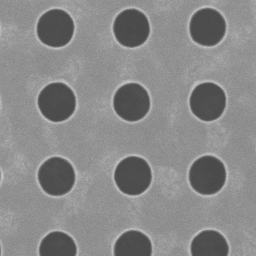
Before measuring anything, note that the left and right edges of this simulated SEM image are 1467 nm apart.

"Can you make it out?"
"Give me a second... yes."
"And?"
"a regular array of holes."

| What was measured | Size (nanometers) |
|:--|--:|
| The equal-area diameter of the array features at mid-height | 215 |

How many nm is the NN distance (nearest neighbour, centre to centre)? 423